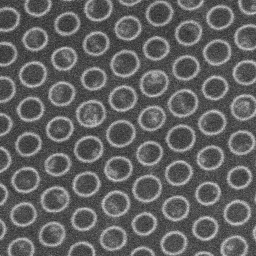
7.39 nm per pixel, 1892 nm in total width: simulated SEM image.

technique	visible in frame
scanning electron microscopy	a regular array of raised bodies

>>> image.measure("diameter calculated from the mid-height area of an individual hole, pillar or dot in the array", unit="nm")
176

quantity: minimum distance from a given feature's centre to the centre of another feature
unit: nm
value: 257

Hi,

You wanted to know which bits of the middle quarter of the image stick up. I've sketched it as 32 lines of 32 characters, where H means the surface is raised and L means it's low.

HHLLLLLLLLLLHHHHHHLLLLLLLLLLHHHH
LLLLLLHHHLLLHHHHHHLLLLLLLLLHHHHH
LLLLLHHHHHLLLHHHHLLLLHHHHLLLHHHH
LLLLLHHHHHLLLLLLLLLLHHHHHHLLLHHH
LLLLLHHHHHLLLLLLLLLHHHHHHHLLLLLL
HHLLLHHHHLLLLLLLLLLHHHHHHHLLLLLL
HHLLLLLLLLLLLHHHHLLLHHHHHLLLLLLL
HHLLLLLLLLLLHHHHHHLLHHHHLLLLHHHH
HHLLLLLLLLLLHHHHHHLLLLLLLLLHHHHH
HLLLLLHHLLLLHHHHHHLLLLLLLLHHHHHH
LLLLHHHHHHLLHHHHHLLLLLLLLLHHHHHH
LLLLHHHHHHLLLHHLLLLLHHHHLLLHHHHH
LLLHHHHHHHLLLLLLLLLHHHHHHLLLHHHL
LLLLHHHHHHLLLLLLLLLHHHHHHLLLLLLL
HLLLHHHHHLLLLHHHLLLHHHHHHLLLLLLL
HHLLLLHLLLLLHHHHHLLHHHHHLLLLLHLL
HHLLLLLLLLLHHHHHHLLLLLLLLLLHHHHH
HHLLLLLLLLLHHHHHHHLLLLLLLLHHHHHH
HLLLLHHHLLLHHHHHHLLLLLLLLLHHHHHH
LLLLHHHHHLLHHHHHHLLLLLLLLLHHHHHH
LLLHHHHHHLLLLHLLLLLHHHHHLLHHHHHH
LLLHHHHHHLLLLLLLLLLHHHHHLLLLHHLL
LLLHHHHHHLLLLLLLLLHHHHHHLLLLLLLL
HLLLHHHHLLLLLHHLLLLHHHHHLLLLLLLL
HLLLLLLLLLLHHHHHLLLHHHHLLLLLHHLL
HLLLLLLLLLLHHHHHHLLLLLLLLLHHHHHL
HLLLLLLLLLLHHHHHHLLLLLLLLLHHHHHH
LLLLLHHLLLLHHHHHLLLLLLLLLLHHHHHH
LLLHHHHHLLLLHHHLLLLHHHHLLLHHHHHL
LLLHHHHHHLLLLLLLLLHHHHHHLLHHHHLL
LLLHHHHHHLLLLLLLLLHHHHHHLLLLLLLL
LLLHHHHHLLLLLLLLLHHHHHHHLLLLLLLL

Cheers